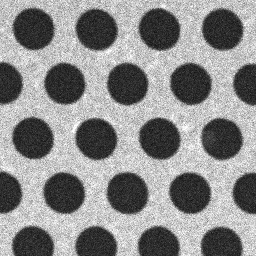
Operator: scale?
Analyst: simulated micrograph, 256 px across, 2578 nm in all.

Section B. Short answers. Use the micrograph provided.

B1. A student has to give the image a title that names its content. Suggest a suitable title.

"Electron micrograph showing a regular array of holes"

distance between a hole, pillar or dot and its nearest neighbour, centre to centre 632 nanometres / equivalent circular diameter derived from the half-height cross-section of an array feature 423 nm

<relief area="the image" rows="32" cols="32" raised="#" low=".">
################################
###...#####..#####...#####...###
##.....###....####....####....##
##.....##......##......##.....##
##.....###.....###.....##.....##
##....####....####....####....##
################################
################################
..####....####....####...#####..
...###....####....###.....###...
...###.....##......##.....###...
...###....####....####....###...
..#####...####....####....####..
################################
################################
##....####....####....####...###
##.....###....###.....###.....##
##.....##......##......##.....##
##.....###....####....###.....##
###...#####...#####...####...###
################################
################################
..####....####....####....####..
...##......##.....###.....###...
...##......##......##.....###...
..####....####....####....###...
.######..######..######..######.
################################
###..######..######..######.####
##....####....####....###.....##
##.....##......##.....###.....##
##.....###.....##.....###.....##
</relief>